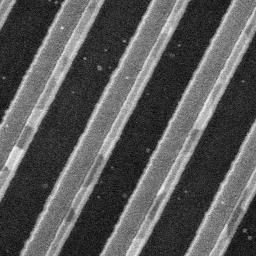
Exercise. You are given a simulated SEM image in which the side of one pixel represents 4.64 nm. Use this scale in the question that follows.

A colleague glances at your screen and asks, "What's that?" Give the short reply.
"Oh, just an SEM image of lines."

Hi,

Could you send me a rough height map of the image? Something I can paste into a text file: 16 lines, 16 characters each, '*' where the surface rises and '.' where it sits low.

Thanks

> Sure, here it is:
*...**...**...**
...***...**...**
...**...**...***
..***...**...**.
..**...**...***.
.***...**...**..
.**...**...**...
**....**...**...
**...**...**....
*....**...**...*
*...**...**....*
....**...**...**
...**...**...***
...**...**...**.
..**...**...***.
..**...**...**..